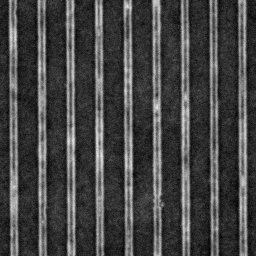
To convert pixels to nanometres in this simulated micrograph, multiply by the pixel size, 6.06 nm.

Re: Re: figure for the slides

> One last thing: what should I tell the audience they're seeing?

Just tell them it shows parallel lines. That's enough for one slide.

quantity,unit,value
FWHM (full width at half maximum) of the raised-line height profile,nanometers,36.4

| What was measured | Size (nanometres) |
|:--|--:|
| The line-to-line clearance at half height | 134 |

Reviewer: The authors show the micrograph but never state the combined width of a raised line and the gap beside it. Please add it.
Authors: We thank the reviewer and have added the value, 173 nanometers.